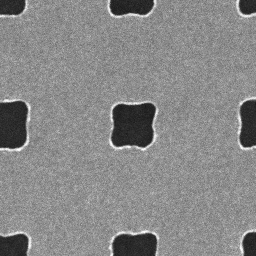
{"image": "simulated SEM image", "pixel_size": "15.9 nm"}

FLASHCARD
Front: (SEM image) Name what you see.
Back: holes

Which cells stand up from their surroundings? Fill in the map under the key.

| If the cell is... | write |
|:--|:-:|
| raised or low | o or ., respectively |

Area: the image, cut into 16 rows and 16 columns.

.oooooo..oooooo.
oooooooooooooooo
oooooooooooooooo
oooooooooooooooo
oooooooooooooooo
oooooooooooooooo
.ooooooo.oooooo.
..ooooo...ooooo.
..ooooo...ooooo.
oooooooooooooooo
oooooooooooooooo
oooooooooooooooo
oooooooooooooooo
oooooooooooooooo
oooooooooooooooo
..ooooo...ooooo.